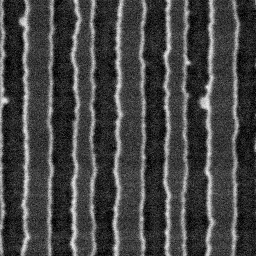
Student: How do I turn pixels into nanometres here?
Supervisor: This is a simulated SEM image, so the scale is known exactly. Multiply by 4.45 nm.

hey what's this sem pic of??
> lines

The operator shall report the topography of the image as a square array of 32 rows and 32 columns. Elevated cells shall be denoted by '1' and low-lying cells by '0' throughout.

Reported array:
00011110011100011100011000111000
00011110011100011100011000111100
00011110001100011100011000111100
00011110011100011100011000111100
00011100011100011100011000111100
00011110011100011100011000111100
00011110011100011100011000111100
00011110011100011100011000111000
00011100011100011100011000111000
00011100011000011100011000111100
00011110011100011100011000111100
00011100011100011100011000111100
00011100001100011100011000111100
00011100001100011100011000111000
00011100001100011100011000111100
00011100011100011100011000111100
00011100011100011100011000111100
00011110011000011100011000111000
00011110011100011100011000111000
00011100011100111100011000111000
00011100011100111100011000111100
00011110011100111100011000111000
00011100011100111100011000111000
00011100011100011100011000111100
00011100011100011100011000111000
00011100011100111100011000111100
00011100011100111100011000111100
00011100011100111100011000111000
00011100011100111100011000111000
00011100011100111100011000111000
00011100011100111100011000111000
00011100011100111100011000111000